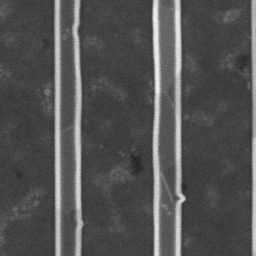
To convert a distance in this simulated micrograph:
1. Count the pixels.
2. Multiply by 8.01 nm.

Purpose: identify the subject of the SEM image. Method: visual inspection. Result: one or a few lines or trenches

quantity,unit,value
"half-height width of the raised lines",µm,0.174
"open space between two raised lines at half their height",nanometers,619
